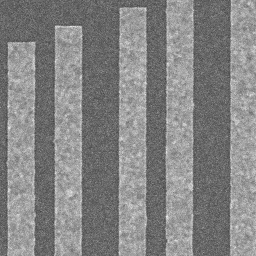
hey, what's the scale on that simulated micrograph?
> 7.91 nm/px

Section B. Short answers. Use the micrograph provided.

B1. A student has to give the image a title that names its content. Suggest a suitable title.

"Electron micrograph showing parallel lines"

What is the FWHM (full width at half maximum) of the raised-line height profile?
206 nm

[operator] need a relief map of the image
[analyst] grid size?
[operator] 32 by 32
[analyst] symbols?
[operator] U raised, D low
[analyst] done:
DDDDDDDDDDDDDDDDDDDDDUUUDDDDDUUU
DDDDDDDDDDDDDDDUUUDDDUUUDDDDDUUU
DDDDDDDDDDDDDDDUUUDDDUUUDDDDDUUU
DDDDDDDUUUDDDDDUUUDDDUUUDDDDDUUU
DDDDDDDUUUDDDDDUUUDDDUUUDDDDDUUU
DUUUDDDUUUDDDDDUUUDDDUUUDDDDDUUU
DUUUDDDUUUDDDDDUUUDDDUUUDDDDDUUU
DUUUDDDUUUDDDDDUUUDDDUUUDDDDDUUU
DUUUDDDUUUDDDDDUUUDDDUUUDDDDDUUU
DUUUDDDUUUDDDDDUUUDDDUUUDDDDDUUU
DUUUDDDUUUDDDDDUUUDDDUUUDDDDDUUU
DUUUDDDUUUDDDDDUUUDDDUUUDDDDDUUU
DUUUDDDUUUDDDDDUUUDDDUUUDDDDDUUU
DUUUDDDUUUDDDDDUUUDDDUUUDDDDDUUU
DUUUDDDUUUDDDDDUUUDDDUUUDDDDDUUU
DUUUDDDUUUDDDDDUUUDDDUUUDDDDDUUU
DUUUDDDUUUDDDDDUUUDDDUUUDDDDDUUU
DUUUDDDUUUDDDDDUUUDDDUUUDDDDDUUU
DUUUDDDUUUDDDDDUUUDDDUUUDDDDDUUU
DUUUDDDUUUDDDDDUUUDDDUUUDDDDDUUU
DUUUDDDUUUDDDDDUUUDDDUUUDDDDDUUU
DUUUDDDUUUDDDDDUUUDDDUUUDDDDDUUU
DUUUDDDUUUDDDDDUUUDDDUUUDDDDDUUU
DUUUDDDUUUDDDDDUUUDDDUUUDDDDDUUU
DUUUDDDUUUDDDDDUUUDDDUUUDDDDDUUU
DUUUDDDUUUDDDDDUUUDDDUUUDDDDDUUU
DUUUDDDUUUDDDDDUUUDDDUUUDDDDDUUU
DUUUDDDUUUDDDDDUUUDDDUUUDDDDDUUU
DUUUDDDUUUDDDDDUUUDDDUUUDDDDDUUU
DUUUDDDUUUDDDDDUUUDDDUUUDDDDDUUU
DUUUDDDUUUDDDDDUUUDDDUUUDDDDDUUU
DUUUDDDUUUDDDDDUUUDDDUUUDDDDDUUU